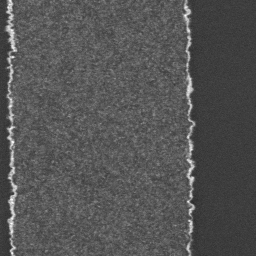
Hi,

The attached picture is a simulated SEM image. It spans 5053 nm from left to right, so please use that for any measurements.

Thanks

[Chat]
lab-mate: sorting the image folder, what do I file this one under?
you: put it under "one or a few lines or trenches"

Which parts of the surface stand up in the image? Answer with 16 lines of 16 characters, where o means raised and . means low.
.ooooooooooo....
.ooooooooooo....
.ooooooooooo....
.ooooooooooo....
.ooooooooooo....
.ooooooooooo....
.ooooooooooo....
.ooooooooooo....
.ooooooooooo....
.ooooooooooo....
.ooooooooooo....
.ooooooooooo....
.ooooooooooo....
.ooooooooooo....
.ooooooooooo....
.ooooooooooo....